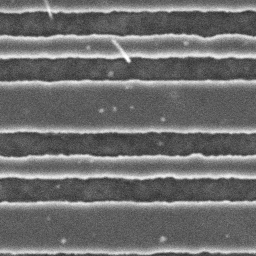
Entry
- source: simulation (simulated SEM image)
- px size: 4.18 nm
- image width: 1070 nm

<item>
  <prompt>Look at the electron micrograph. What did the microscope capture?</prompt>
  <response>lines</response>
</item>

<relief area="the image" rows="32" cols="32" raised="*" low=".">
********************************
***...*.***..*..................
................................
................................
*......***.***..*..******..****.
********************************
********************************
................................
................................
................................
********************************
********************************
********************************
********************************
********************************
********************************
**..****************.***********
................................
................................
.......*.**.............*......*
********************************
********************************
................................
................................
................................
********************************
********************************
********************************
********************************
********************************
********************************
*************************.******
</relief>